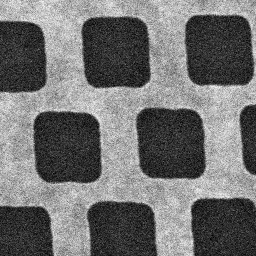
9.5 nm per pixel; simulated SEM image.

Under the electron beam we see holes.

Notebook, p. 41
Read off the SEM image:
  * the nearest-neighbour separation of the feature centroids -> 982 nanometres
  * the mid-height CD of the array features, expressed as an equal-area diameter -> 725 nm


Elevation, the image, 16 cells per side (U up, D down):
UUUUUUUUUUUUUUUU
DDUUUDDDDUUUDDDD
DDDUUDDDDUUUDDDD
DDDUUDDDDUUUDDDD
DDDUUDDDDUUUDDDD
DDDUUUDUUUUUUUUU
UUUUUUUUUUUUUUUU
UUDDDDUUUDDDDUUD
UUDDDDUUUDDDDUUD
UUDDDDUUUDDDDUUD
UUDDDDUUUDDDDUUD
UUUUUUUUUUUUUUUU
UUUUUUUUUUUUDDDD
DDDUUDDDDDUUDDDD
DDDUUUDDDDUUDDDD
DDDUUUDDDDUUDDDD